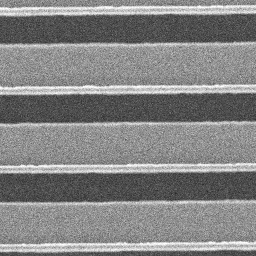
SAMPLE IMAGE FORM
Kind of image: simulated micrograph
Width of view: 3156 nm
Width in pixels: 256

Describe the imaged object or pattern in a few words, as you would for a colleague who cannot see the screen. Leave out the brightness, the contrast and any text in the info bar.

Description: lines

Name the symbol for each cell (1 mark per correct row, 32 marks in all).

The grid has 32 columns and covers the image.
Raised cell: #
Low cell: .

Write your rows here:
################################
################################
................................
................................
................................
.............................###
################################
################################
################################
################################
################################
##########################......
................................
................................
................................
...........#####################
################################
################################
################################
################################
################################
##..#...........................
................................
................................
................................
################################
################################
################################
################################
################################
################################
................................